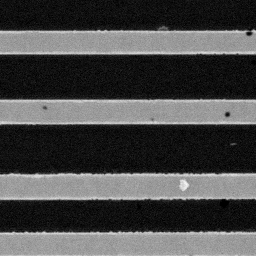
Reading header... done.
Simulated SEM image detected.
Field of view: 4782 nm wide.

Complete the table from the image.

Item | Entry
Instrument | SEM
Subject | lines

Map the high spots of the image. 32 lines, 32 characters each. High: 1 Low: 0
00000000000000000000000000000000
00000000000000000000000000000000
00000000000000000000000000000000
00000000000000000000000000000000
11111111111111111111111111111111
11111111111111111111111111111111
11111111111111111111111111111111
00000000000000000000000000000000
00000000000000000000000000000000
00000000000000000000000000000000
00000000000000000000000000000000
00000000000000000000000000000000
00000000000000000000000000000000
11111111111111111111111111111111
11111111111111111111111111111111
00000000000000000000000000000000
00000000000000000000000000000000
00000000000000000000000000000000
00000000000000000000000000000000
00000000000000000000000000000000
00000000000000000000000000000000
00000000000000000000000000000000
11111111111111111111111111111111
11111111111111111111111111111111
11111111111111111111111111111111
00000000000000000000000000000000
00000000000000000000000000000000
00000000000000000000000000000000
00000000000000000000000000000000
11111111111111111111111111111111
11111111111111111111111111111111
11111111111111111111111111111111